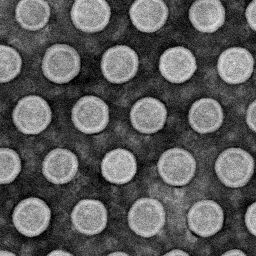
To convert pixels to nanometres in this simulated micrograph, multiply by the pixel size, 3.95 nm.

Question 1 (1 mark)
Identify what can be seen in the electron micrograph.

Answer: a regular array of raised bodies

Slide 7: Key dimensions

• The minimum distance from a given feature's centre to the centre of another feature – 0.228 µm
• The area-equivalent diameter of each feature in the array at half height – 133 nm